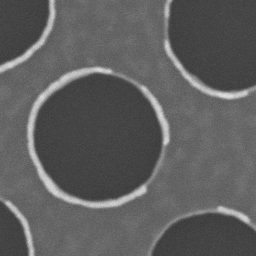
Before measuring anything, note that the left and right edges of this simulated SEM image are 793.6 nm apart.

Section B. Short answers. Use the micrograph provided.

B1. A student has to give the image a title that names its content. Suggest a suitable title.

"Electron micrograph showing holes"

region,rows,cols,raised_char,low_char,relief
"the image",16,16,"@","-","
---@@@@@@@@-----
---@@@@@@@@-----
--@@@@@@@@@-----
-@@@@@@@@@@-----
@@@@@@@@@@@@----
@@@@-----@@@@---
@@@------@@@@@@@
@@--------@@@@@@
@@--------@@@@@@
@@--------@@@@@@
@@@-------@@@@@@
@@@------@@@@@@@
@@@@@--@@@@@@@@@
-@@@@@@@@@@@---@
--@@@@@@@@------
--@@@@@@@@------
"